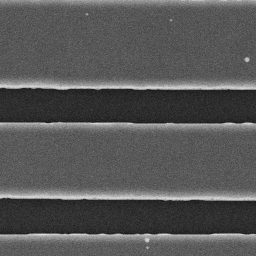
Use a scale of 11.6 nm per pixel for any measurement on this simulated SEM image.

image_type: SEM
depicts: lines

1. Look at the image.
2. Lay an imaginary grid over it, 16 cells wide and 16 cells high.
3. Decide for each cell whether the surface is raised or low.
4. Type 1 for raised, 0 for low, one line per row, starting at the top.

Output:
1111111111111111
1111111111111111
1111111111111111
1111111111111111
1111111111111111
0101111111111111
0000000000000000
0000000000000000
1111111111111111
1111111111111111
1111111111111111
1111111111111111
0000000000000011
0000000000000000
0000000000000000
1111111111111111